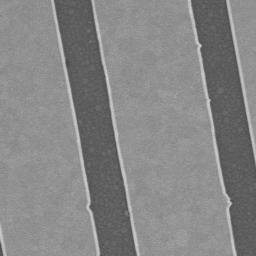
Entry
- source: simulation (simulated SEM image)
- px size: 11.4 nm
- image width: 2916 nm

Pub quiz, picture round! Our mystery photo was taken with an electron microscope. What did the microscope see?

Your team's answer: one or a few lines or trenches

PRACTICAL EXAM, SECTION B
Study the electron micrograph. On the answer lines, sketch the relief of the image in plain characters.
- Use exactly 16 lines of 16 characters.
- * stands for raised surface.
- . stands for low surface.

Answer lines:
***...******..**
****..******..**
****..******...*
****..******...*
****...******..*
****...******..*
****...******..*
*****..******...
*****..******...
*****..*******..
*****...******..
*****...******..
******..******..
******..******..
******..******..
******...******.